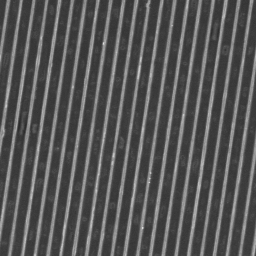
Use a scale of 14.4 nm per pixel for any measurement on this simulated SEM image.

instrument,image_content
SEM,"parallel lines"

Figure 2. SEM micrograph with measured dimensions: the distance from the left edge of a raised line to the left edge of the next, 183 nanometres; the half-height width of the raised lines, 41.1 nm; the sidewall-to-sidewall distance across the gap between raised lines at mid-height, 134 nanometers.